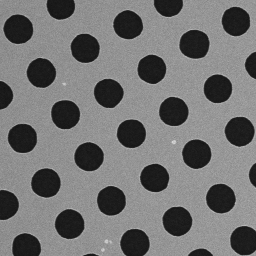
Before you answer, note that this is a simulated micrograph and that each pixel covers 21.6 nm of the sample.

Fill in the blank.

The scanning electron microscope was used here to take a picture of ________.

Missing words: a regular array of holes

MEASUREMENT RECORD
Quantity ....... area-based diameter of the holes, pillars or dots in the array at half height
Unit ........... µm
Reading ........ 0.637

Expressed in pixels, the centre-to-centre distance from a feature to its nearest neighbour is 48.1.